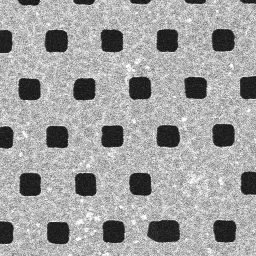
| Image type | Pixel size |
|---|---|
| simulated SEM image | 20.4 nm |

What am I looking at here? a regular array of holes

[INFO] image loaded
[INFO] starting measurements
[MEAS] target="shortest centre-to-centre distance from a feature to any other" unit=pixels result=54.8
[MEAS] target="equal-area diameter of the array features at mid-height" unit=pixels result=24.5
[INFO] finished